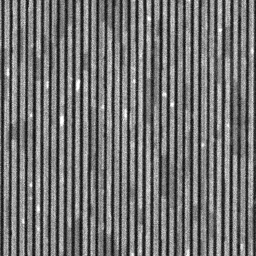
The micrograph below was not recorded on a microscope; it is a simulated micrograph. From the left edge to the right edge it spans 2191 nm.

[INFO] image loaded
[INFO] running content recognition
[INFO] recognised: parallel lines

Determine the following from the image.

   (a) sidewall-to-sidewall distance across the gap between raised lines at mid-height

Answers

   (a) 0.0289 um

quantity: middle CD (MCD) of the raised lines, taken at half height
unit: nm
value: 36.4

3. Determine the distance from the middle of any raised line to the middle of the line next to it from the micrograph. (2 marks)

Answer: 67.5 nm